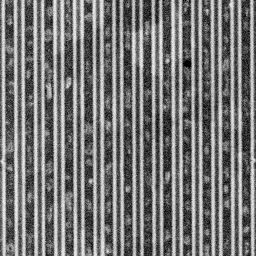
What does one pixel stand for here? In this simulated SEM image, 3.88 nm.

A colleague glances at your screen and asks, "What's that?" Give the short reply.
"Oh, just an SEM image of parallel lines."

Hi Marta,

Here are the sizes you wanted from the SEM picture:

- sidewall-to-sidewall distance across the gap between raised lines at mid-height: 46.6 nm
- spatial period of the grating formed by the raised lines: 76.5 nanometres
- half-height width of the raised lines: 30.1 nm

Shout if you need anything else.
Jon